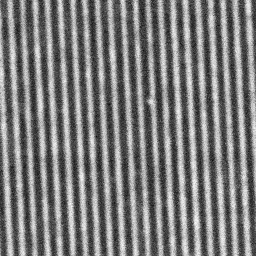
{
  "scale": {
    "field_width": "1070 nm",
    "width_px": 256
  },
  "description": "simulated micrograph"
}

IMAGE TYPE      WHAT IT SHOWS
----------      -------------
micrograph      parallel lines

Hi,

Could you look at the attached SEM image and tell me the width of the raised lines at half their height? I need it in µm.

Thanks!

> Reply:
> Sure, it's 0.0177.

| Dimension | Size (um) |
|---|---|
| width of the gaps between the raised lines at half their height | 0.0349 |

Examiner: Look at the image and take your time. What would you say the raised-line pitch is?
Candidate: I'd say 12.5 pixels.